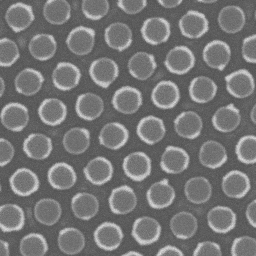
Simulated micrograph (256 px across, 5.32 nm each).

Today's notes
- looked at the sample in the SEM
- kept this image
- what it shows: a regular array of raised bodies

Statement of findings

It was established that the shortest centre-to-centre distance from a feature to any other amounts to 200 nm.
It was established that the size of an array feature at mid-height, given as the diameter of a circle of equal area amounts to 147 nm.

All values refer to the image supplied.